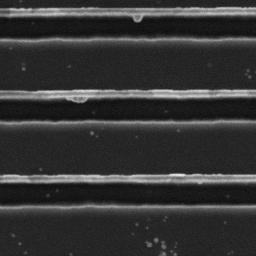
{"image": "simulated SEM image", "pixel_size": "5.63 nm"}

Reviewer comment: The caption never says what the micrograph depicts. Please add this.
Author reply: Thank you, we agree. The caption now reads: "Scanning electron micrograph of lines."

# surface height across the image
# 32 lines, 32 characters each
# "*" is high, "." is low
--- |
********************************
********************************
.................*..............
................................
................................
********************************
********************************
********************************
********************************
********************************
********************************
********************************
.........**.....................
................................
................................
********************************
********************************
********************************
********************************
********************************
********************************
********************************
********************************
................................
................................
................................
********************************
********************************
********************************
********************************
********************************
********************************